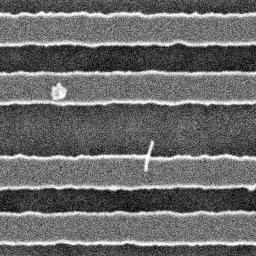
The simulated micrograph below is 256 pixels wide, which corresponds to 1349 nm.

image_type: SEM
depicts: lines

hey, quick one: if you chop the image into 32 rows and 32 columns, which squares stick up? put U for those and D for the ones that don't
DDDDDDDDDDDDDDDDDDDDDDDDDDDDDDDD
DDDDDDDDDDDDDDDDDDDDDDDDDDDDDDDD
UUUUUUUUUUUUUUUUUUUUUUUUUUUUUUUU
UUUUUUUUUUUUUUUUUUUUUUUUUUUUUUUU
UUUUUUUUUUUUUUUUUUUUUUUUUUUUUUUU
UUUUUUUUDUUUUUUUUUUUUUDUUUUUUUUU
DDDDDDDDDDDDDDDDDDDDDDDDDDDDDDDD
DDDDDDDDDDDDDDDDDDDDDDDDDDDDDDDD
DDDDDDDDDDDDDDDDDDDDDDDDDDDDDDDD
UUUUUUUUUUUUUUUUUUUUUUUUUUUUUUUU
UUUUUUUUUUUUUUUUUUUUUUUUUUUUUUUU
UUUUUUUUUUUUUUUUUUUUUUUUUUUUUUUU
UUUUUUUUUUUUUUUUUUUUUUUUUUUUUUUU
DDDDDDDDDDDDDDDDDDDDDDDDDDDDDDDD
DDDDDDDDDDDDDDDDDDDDDDDDDDDDDDDD
DDDDDDDDDDDDDDDDDDDDDDDDDDDDDDDD
DDDDDDDDDDDDDDDDDDDDDDDDDDDDDDDD
DDDDDDDDDDDDDDDDDDDDDDDDDDDDDDDD
DDDDDDDDDDDDDDDDDDDDDDDDDDDDDDDD
UDUDDDDUDDUDUUUUUUUDDDUUDUDUUDDD
UUUUUUUUUUUUUUUUUUUUUUUUUUUUUUUU
UUUUUUUUUUUUUUUUUUUUUUUUUUUUUUUU
UUUUUUUUUUUUUUUUUUUUUUUUUUUUUUUU
UUUUUUDUDUUUUUUUUUUUUUDDDUUUUDDD
DDDDDDDDDDDDDDDDDDDDDDDDDDDDDDDD
DDDDDDDDDDDDDDDDDDDDDDDDDDDDDDDD
DDDUDDDDDDDDDDUUDDDUUUDDDUDDUUUU
UUUUUUUUUUUUUUUUUUUUUUUUUUUUUUUU
UUUUUUUUUUUUUUUUUUUUUUUUUUUUUUUU
UUUUUUUUUUUUUUUUUUUUUUUUUUUUUUUU
UUUUUUUDDUUUUUUDDUUUUUUUUUUUUUUU
DDDDDDDDDDDDDDDDDDDDDDDDDDDDDDDD